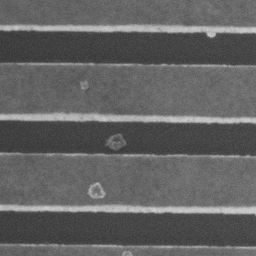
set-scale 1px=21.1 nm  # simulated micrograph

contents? lines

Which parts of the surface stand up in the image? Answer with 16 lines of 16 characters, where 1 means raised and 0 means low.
1111111111111111
1111111111111111
0000000000000000
0000000000000000
1111111111111111
1111111111111111
1111111111111111
0000000000001111
0000000000000000
0000000000000000
1111111111111111
1111111111111111
1111111111111111
0000000000000000
0000000000000000
1111111111111111